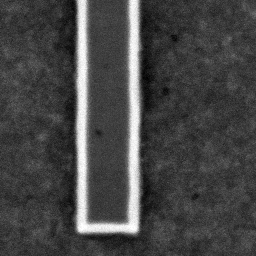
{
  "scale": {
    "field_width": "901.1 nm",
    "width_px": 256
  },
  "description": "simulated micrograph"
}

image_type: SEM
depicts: one or a few lines or trenches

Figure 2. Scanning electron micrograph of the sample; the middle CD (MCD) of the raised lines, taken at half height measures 52.6 px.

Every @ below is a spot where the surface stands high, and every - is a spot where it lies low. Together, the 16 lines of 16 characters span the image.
-----@@@--------
-----@@@--------
-----@@@--------
-----@@@--------
-----@@@--------
-----@@@--------
-----@@@--------
-----@@@--------
-----@@@--------
-----@@@--------
-----@@@--------
-----@@@--------
-----@@@--------
-----@@@--------
----------------
----------------